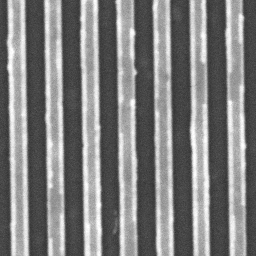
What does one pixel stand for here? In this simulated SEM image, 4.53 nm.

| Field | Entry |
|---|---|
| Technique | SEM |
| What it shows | parallel lines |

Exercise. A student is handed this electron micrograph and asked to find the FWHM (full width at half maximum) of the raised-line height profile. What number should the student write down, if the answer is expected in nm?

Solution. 70.7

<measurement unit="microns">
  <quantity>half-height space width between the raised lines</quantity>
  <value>0.0939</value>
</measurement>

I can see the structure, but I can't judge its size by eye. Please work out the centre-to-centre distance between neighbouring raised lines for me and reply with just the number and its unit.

0.165 um